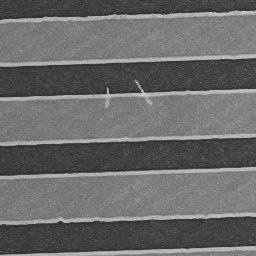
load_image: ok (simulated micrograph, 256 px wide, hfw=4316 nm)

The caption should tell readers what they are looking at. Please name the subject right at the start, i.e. one or a few lines or trenches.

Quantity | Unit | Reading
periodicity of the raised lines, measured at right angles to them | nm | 1330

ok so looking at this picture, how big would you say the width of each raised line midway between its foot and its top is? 750 nanometers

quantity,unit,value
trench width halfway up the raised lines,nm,573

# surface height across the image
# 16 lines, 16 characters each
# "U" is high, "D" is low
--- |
DDDDDDDDDDDDDDDD
UUUUUUUUUUUUUUUU
UUUUUUUUUUUUUUUU
UUUUUUUUUUUUUUUU
DDDDDDDDDDDDDDDD
DDDDDDDDDDDDDDDD
UUUUUUUUUUUUUUUU
UUUUUUUUUUUUUUUU
UUUUUUUUUUUUUUUD
DDDDDDDDDDDDDDDD
DDDDDDDDDDDDDDDD
UUUUUUUUUUUUUUUU
UUUUUUUUUUUUUUUU
UUUUUUUUUUUUUUDD
DDDDDDDDDDDDDDDD
DDDDDDDDDDDDDDDD